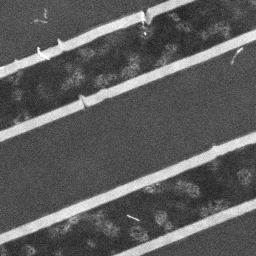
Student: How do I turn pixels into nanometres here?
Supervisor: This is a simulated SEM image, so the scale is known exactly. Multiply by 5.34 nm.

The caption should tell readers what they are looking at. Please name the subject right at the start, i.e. one or a few lines or trenches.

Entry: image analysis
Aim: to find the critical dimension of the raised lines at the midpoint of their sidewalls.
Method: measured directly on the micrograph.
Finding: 322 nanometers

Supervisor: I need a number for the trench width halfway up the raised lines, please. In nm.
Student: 507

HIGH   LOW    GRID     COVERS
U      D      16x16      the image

DDDDDDDDDDUUUUUU
DDDDDDDUUUUUUUUU
DDDDDUUUUUUUUUUD
DDUUUUUUUUUUUDDD
UUUUUUUUUUDDDDDD
UUUUUUUUDDDDDDDD
UUUUUDDDDDDDDDDD
UUUDDDDDDDDDDDDD
DDDDDDDDDDDDDDDD
DDDDDDDDDDDDDUUU
DDDDDDDDDDDUUUUU
DDDDDDDDDUUUUUUU
DDDDDDUUUUUUUUUU
DDDDUUUUUUUUUUDD
DUUUUUUUUUUUDDDD
UUUUUUUUUDDDDDDD